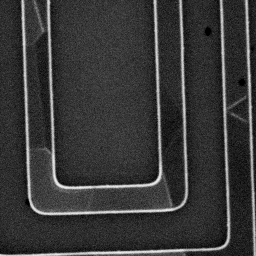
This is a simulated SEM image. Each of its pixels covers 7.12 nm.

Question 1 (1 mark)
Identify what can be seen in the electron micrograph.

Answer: groups of lines, slits or small figures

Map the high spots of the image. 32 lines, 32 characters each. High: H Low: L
LLLHHHLLLLLLLLLLLLLHHHHLLLLLHHHL
LLLHHHLLLLLLLLLLLLLHHHHLLLLLHHHL
LLLHHHLLLLLLLLLLLLLHHHHLLLLLHHHL
LLLHHHLLLLLLLLLLLLLHHHHLLLLLHHHL
LLLHHHLLLLLLLLLLLLLLHHHLLLLLHHHL
LLLHHHLLLLLLLLLLLLLLHHHLLLLLHHHL
LLLHHHLLLLLLLLLLLLLLHHHLLLLLHHHL
LLLHHHLLLLLLLLLLLLLLHHHLLLLLHHHL
LLLHHHLLLLLLLLLLLLLLHHHLLLLLHHHL
LLLHHHLLLLLLLLLLLLLLHHHLLLLLHHHL
LLLHHHLLLLLLLLLLLLLLHHHLLLLLHHHL
LLLHHHLLLLLLLLLLLLLLHHHLLLLLHHHL
LLLHHHLLLLLLLLLLLLLLHHHLLLLLHHHL
LLLHHHLLLLLLLLLLLLLLHHHLLLLLHHHL
LLLHHHLLLLLLLLLLLLLLHHHLLLLLHHHL
LLLHHHHLLLLLLLLLLLLLHHHLLLLLHHHL
LLLHHHHLLLLLLLLLLLLLHHHLLLLLHHHL
LLLHHHHLLLLLLLLLLLLLHHHLLLLLHHHL
LLLHHHHLLLLLLLLLLLLLHHHLLLLLHHHL
LLLHHHHLLLLLLLLLLLLLHHHLLLLLHHHL
LLLLHHHLLLLLLLLLLLLLHHHLLLLLHHHL
LLLLHHHLLLLLLLLLLLLLHHHLLLLLHHHL
LLLLHHHLLLLLLLLLLLLLHHHLLLLLHHHH
LLLLHHHHHLHHHHHHHHHHHHHLLLLLHHHH
LLLLHHHHHHHHHHHHHHHHHHHLLLLLLHHH
LLLLHHHHHHHHHHHHHHHHHHHLLLLLLHHH
LLLLLHHHHHHHHHLLLLLLLLLLLLLLLHHH
LLLLLLLLLLLLLLLLLLLLLLLLLLLLLHHH
LLLLLLLLLLLLLLLLLLLLLLLLLLLLLHHH
LLLLLLLLLLLLLLLLLLLLLLLLLLLLLHHH
LLLLLLLLLLLLLLLLLLLLLLLLLLLLHHHH
LLLLLLLLLLLLLLLLLLLHHHHHHHHHHHHH